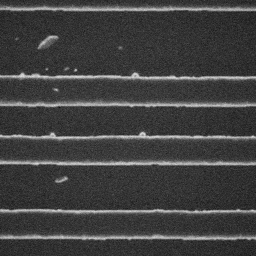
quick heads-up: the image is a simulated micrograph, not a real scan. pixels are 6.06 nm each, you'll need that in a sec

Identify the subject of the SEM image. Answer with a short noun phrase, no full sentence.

lines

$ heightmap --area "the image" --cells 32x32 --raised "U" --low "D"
UUUUUUUUUUUUUUUUUUUUUUUUUUUUUUUU
DDDDDDDDDDDDDDDDDDDDDDDDDDDDDDDD
DDDDDDDDDDDDDDDDDDDDDDDDDDDDDDDD
DDDDDDDDDDDDDDDDDDDDDDDDDDDDDDDD
DDDDDDDDDDDDDDDDDDDDDDDDDDDDDDDD
DDDDDDDDDDDDDDDDDDDDDDDDDDDDDDDD
DDDDDDDDDDDDDDDDDDDDDDDDDDDDDDDD
DDDDDDDDDDDDDDDDDDDDDDDDDDDDDDDD
DDDDDDDDDDDDDDDDDDDDDDDDDDDDDDDD
DDDDDDDDDDDDDDDDDDDDDDDDDDDDDDDD
UUUUUUUUUUUUUUUUUUUUUUUUUUUUUUUU
UUUUUUUUUUUUUUUUUUUUUUUUUUUUUUUU
UUUUUUUUUUUUUUUUUUUUUUUUUUUUUUUU
DDDDDDDDDDDDDDDDDDDDDDDDDDDDDDDD
DDDDDDDDDDDDDDDDDDDDDDDDDDDDDDDD
DDDDDDDDDDDDDDDDDDDDDDDDDDDDDDDD
DDDDDDDDDDDDDDDDDDDDDDDDDDDDDDDD
UUUUUUUUUUUUUUUUUUUUUUUUUUUUUUUU
UUUUUUUUUUUUUUUUUUUUUUUUUUUUUUUU
UUUUUUUUUUUUUUUUUUUUUUUUUUUUUUUU
DDDDDDDDUDUUDUDDDDDDDDDDDDUDDDUU
DDDDDDDDDDDDDDDDDDDDDDDDDDDDDDDD
DDDDDDDDDDDDDDDDDDDDDDDDDDDDDDDD
DDDDDDDDDDDDDDDDDDDDDDDDDDDDDDDD
DDDDDDDDDDDDDDDDDDDDDDDDDDDDDDDD
DDDDDDDDDDDDDDDDDDDDDDDDDDDDDDDD
UUUUUUUUUUUUUUUUUUUUUUUUDDUUUUUU
UUUUUUUUUUUUUUUUUUUUUUUUUUUUUUUU
UUUUUUUUUUUUUUUUUUUUUUUUUUUUUUUU
UUUUUUUUUUUUUUUUUUUUUUUUUUUUUUUU
DDDDDDDDDDDDDDDDDDDDDDDDDDDDDDDD
DDDDDDDDDDDDDDDDDDDDDDDDDDDDDDDD